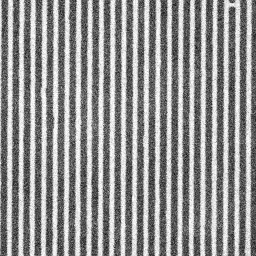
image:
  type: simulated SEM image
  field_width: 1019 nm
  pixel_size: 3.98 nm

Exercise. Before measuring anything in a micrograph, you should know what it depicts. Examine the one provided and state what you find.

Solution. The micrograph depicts parallel lines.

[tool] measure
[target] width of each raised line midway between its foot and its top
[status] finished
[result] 17.9 nm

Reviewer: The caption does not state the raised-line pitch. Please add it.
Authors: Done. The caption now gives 45.3 nm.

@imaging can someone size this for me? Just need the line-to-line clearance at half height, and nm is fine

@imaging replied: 28.9